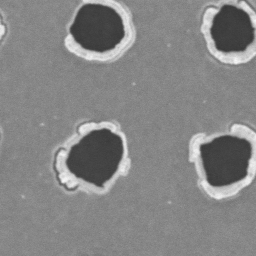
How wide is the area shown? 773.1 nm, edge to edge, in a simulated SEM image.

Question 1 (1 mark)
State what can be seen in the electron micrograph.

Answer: holes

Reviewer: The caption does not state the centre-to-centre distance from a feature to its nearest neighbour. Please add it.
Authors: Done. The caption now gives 392 nanometres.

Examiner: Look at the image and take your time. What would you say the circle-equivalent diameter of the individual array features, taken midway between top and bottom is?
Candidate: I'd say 0.157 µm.